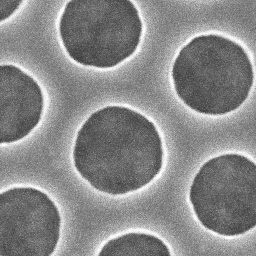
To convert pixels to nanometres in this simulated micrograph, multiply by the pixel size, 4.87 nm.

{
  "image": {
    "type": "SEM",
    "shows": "holes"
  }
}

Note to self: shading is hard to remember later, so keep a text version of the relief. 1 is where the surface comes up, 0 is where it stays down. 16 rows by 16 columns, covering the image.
0111000011111111
1111000001111111
1111000001110011
1111000011100000
0011111111100000
0001111111100000
0001111111110001
0011100001111111
0011100000111111
1111100000111111
1111100000111000
1111110001110000
0001111111110000
0000111111110000
0000111111111001
0001110000111111